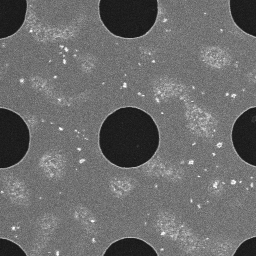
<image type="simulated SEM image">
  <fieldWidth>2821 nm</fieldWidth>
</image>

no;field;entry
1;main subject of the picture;holes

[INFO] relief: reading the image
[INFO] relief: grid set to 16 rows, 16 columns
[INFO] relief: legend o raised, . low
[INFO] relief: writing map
..oooo....oooo..
.oooooo...ooooo.
oooooooooooooooo
oooooooooooooooo
oooooooooooooooo
oooooooooooooooo
oooooooooooooooo
.oooooo...ooooo.
..oooo....oooo..
..oooo....ooooo.
oooooooooooooooo
oooooooooooooooo
oooooooooooooooo
oooooooooooooooo
oooooooooooooooo
.oooooo..oooooo.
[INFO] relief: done